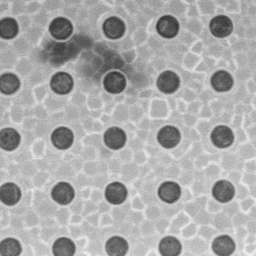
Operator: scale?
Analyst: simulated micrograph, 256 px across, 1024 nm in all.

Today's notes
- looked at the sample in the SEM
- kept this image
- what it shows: a regular array of holes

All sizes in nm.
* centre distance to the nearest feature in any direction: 212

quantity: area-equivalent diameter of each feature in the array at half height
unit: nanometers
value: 96.8